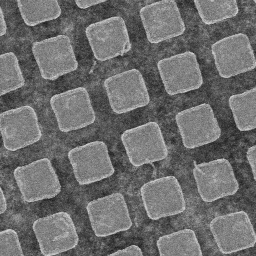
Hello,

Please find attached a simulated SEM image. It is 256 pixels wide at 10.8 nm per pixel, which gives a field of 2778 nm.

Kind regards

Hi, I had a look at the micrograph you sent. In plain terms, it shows a regular array of raised bodies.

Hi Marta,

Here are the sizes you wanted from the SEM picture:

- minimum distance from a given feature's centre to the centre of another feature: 602 nm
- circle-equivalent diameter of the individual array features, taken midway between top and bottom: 458 nanometres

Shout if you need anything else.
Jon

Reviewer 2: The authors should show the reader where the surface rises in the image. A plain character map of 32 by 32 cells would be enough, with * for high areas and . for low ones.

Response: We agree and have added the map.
..*****...**.......***...*****..
...****...........****...*****..
...***.......**...*****..***....
*..........*****..*****.........
...........*****..****.......**.
....*****..*****...........****.
....*****...****...........*****
**...****...........*****..*****
**...****...........*****..*****
***..***......****..*****...*...
***..........*****..*****.......
*.......***..*****...**........*
......*****...*****..........***
..**...****...***.......**...***
****...*****..........*****..***
*****..****...........*****...**
*****...........****...****.....
*****..........*****...****.....
.**......****...*****..........*
.........*****..*****..........*
....**...*****...*.......****..*
..*****..*****..........*****...
..*****...**........**..******..
..******..........****...*****..
...****......**...*****..***....
*..........*****..*****.........
...........*****..****..........
.....****..*****...........****.
....*****...****..........*****.
**..******...........***...*****
**...****...........*****..*****
***..***......****..*****...*...